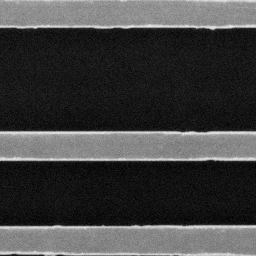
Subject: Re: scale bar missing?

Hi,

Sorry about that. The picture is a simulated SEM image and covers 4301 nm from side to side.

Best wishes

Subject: lines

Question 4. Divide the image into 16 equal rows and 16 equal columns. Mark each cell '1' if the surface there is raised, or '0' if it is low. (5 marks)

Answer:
1111111111111111
1111111111111111
0000000000000000
0000000000000000
0000000000000000
0000000000000000
0000000000000000
0000000000000000
1111111111111111
1111111111111111
0000000000000000
0000000000000000
0000000000000000
0000000000000000
1111111111111111
1111111111111111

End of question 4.